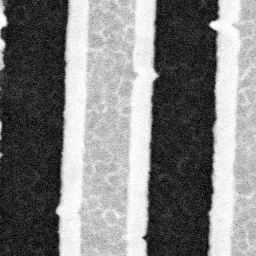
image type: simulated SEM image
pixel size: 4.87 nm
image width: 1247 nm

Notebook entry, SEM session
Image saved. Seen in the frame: one or a few lines or trenches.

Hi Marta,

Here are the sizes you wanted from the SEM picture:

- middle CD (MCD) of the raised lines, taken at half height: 64.2 pixels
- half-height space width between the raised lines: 87.5 px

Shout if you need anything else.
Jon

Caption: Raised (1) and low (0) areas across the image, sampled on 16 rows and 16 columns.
0000011110000011
0000011110000011
0000011110000011
0000011110000011
0000011110000011
0000011110000011
0000011110000011
0000011110000011
0000011110000011
0000011110000011
0000011110000011
0000111110000011
0000111110000011
0000111110000011
0000111100000011
0000111100000011